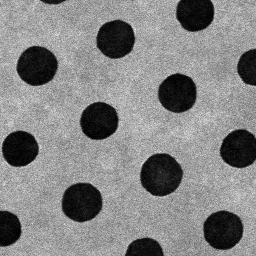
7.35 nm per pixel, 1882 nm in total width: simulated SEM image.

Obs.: a regular array of holes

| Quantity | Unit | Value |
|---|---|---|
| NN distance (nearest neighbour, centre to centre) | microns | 0.603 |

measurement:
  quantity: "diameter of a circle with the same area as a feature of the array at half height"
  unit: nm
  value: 290